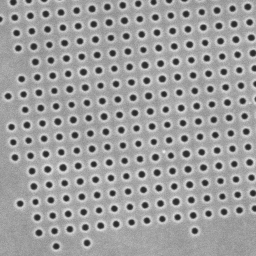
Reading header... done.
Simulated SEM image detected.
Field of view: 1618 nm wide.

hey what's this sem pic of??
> a regular array of holes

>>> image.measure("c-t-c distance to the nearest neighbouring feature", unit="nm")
96.3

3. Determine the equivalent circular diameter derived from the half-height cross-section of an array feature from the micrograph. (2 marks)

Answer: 43.9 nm